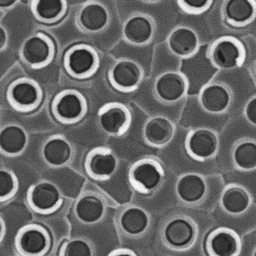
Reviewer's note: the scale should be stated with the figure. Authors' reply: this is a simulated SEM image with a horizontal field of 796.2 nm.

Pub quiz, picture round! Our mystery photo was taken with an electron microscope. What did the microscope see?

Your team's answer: a regular array of holes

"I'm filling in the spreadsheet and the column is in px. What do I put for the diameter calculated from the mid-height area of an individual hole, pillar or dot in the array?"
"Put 26.3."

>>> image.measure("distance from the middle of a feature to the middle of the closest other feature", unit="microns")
0.141